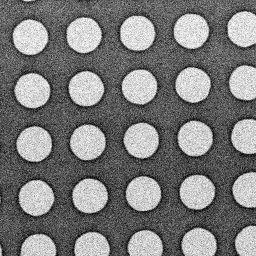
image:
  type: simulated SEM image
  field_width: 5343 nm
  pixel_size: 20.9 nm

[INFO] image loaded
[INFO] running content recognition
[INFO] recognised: an array of small figures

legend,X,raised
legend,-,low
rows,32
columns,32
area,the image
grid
--------------------------------
--------------------------------
----------XX----XXX---XXXX---XXX
--XXXX---XXX---XXXX---XXXX---XXX
--XXXX--XXXXX--XXXX---XXXX---XXX
--XXXX---XXX---XXXX----XX-----XX
---XX-----X---------------------
--------------------------------
------------------------------XX
---XX----XXX----XXX---XXXX---XXX
--XXXX---XXXX--XXXXX--XXXX---XXX
--XXXX---XXXX--XXXX---XXXX---XXX
--XXXX---XXX----XXX----XX-------
--------------------------------
--------------------------------
-----------------X-----XXX----XX
---XXX---XXXX---XXXX--XXXX---XXX
--XXXX---XXXX---XXXX--XXXXX--XXX
--XXXX---XXXX---XXXX---XXX----XX
---XXX----XX-----XX-------------
--------------------------------
--------------------------------
----------XX-----XX----XXX----XX
---XXX---XXXX---XXXX---XXXX--XXX
--XXXXX--XXXX---XXXX---XXXX--XXX
---XXXX--XXXX---XXXX---XXX----XX
---XXX----XX--------------------
--------------------------------
-------------------------------X
----XX----XXX----XXX---XXXX---XX
---XXXX--XXXX---XXXX---XXXX--XXX
---XXXX--XXXXX--XXXX---XXXX---XX